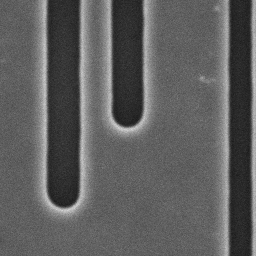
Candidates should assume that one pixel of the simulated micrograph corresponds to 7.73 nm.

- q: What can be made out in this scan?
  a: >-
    groups of lines, slits or small figures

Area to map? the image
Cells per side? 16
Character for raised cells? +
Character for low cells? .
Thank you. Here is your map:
+++..++..+++++..
+++..++..+++++..
+++..++..+++++..
+++..++..+++++..
+++..++..+++++..
+++..++..+++++..
+++..++..+++++..
+++..++..+++++..
+++..+++++++++..
+++..+++++++++..
+++..+++++++++..
+++..+++++++++..
+++..+++++++++..
++++++++++++++..
++++++++++++++..
++++++++++++++..